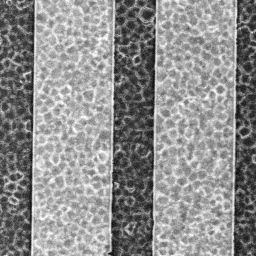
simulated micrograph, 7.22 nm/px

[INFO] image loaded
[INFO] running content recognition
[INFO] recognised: one or a few lines or trenches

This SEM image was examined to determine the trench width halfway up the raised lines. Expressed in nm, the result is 306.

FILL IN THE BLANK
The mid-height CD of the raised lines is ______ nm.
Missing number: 569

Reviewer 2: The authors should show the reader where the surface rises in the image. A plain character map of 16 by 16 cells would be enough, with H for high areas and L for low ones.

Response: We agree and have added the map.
LLHHHHHLLLHHHHHL
LLHHHHHLLLHHHHHL
LLHHHHHLLLHHHHHL
LLHHHHHLLLHHHHHL
LLHHHHHLLLHHHHHL
LLHHHHHLLLHHHHHL
LLHHHHHLLLHHHHHL
LLHHHHHLLLHHHHHL
LLHHHHHLLLHHHHHL
LLHHHHHLLLHHHHHL
LLHHHHHLLLHHHHHL
LLHHHHHLLLHHHHHL
LLHHHHHLLLHHHHHL
LLHHHHHLLLHHHHHL
LLHHHHHLLLHHHHHL
LLHHHHHLLLHHHHHL